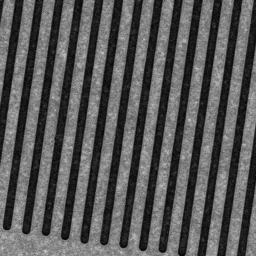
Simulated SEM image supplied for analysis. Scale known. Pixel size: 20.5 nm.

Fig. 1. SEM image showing parallel lines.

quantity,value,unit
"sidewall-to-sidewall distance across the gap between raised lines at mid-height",182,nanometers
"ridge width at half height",223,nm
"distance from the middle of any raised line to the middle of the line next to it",0.402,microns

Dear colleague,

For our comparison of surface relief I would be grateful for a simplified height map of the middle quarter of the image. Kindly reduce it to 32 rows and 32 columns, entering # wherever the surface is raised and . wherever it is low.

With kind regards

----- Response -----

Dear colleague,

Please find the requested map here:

...##...##...##...##..###..###..
...##..###..###..###..###..###..
..###..###..###..###..###..###..
..###..###..###..###..###..###..
..###..###..###..###..###..##...
..###..##...##...##...##...##...
..##...##...##...##...##...##...
..##...##...##...##..###..###..#
..##..###..###..###..###..###..#
.###..###..###..###..###..###..#
.###..###..###..###..###..###..#
.###..###..###..###..###..##...#
.##...##...##...##...##...##...#
.##...##...##...##...##...##...#
.##...##...##..###..###..###..##
###..###..###..###..###..###..##
###..###..###..###..###..###..##
###..###..###..###..###..###..##
###..###..###..###..###..##...##
##...##...##...##...##...##...##
##...##...##...##...##...##...##
##...##...##..###..###..###..###
##..###..###..###..###..###..###
##..###..###..###..###..###..###
##..###..###..###..###..###..###
##..###..###..###..##...##...##.
#...##...##...##...##...##...##.
#...##...##...##...##...##...##.
#...##...##..###..###..###..###.
#..###..###..###..###..###..###.
#..###..###..###..###..###..###.
#..###..###..###..###..###..###.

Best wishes